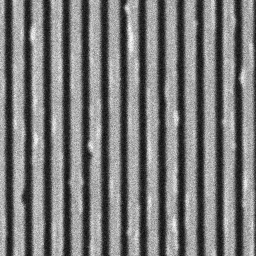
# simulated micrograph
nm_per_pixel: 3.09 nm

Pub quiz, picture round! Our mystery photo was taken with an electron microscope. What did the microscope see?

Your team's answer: parallel lines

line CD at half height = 33.6 nm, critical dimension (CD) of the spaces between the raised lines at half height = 0.0243 microns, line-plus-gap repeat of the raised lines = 59 nanometers